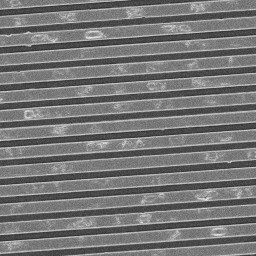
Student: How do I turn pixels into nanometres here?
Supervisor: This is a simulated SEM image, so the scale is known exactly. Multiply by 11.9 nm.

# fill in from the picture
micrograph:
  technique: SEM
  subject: parallel lines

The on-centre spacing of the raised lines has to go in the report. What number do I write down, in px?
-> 18.7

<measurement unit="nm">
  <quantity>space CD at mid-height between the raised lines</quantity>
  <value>80.3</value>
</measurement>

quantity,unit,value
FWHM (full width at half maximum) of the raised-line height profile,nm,140